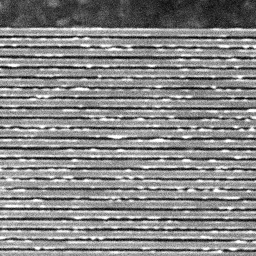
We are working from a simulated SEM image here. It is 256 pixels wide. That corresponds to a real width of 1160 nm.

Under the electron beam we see parallel lines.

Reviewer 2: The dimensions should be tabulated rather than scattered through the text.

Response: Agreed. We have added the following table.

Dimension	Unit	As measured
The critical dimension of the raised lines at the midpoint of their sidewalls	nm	31.7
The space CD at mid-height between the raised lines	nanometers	14.1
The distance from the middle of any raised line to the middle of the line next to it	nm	45.9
